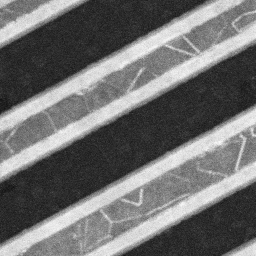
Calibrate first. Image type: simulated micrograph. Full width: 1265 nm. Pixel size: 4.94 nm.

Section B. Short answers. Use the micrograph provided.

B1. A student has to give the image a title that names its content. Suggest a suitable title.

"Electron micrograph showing one or a few lines or trenches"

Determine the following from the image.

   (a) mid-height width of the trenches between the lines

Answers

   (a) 359 nm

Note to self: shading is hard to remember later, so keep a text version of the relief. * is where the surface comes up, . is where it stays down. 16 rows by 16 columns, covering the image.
***..........***
**..........****
..........*****.
........*****...
......*****.....
....******......
..******........
.*****.........*
****..........**
**..........****
..........******
........******..
......*******...
....*******.....
...******.......
.******.........